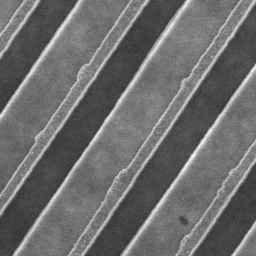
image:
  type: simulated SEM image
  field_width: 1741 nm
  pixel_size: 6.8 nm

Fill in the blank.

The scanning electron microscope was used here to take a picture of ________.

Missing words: lines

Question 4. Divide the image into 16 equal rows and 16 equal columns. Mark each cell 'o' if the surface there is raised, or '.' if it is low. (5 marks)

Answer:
oo...oooo..ooooo
o...oooo...oooo.
o..oooo...oooo..
...oooo..ooooo..
..oooo...oooo...
.oooo...oooo...o
ooooo..ooooo..oo
oooo...oooo...oo
ooo...oooo...ooo
ooo..ooooo..oooo
oo...oooo..ooooo
o...oooo...oooo.
o..ooooo..oooo..
..ooooo..ooooo..
..oooo...oooo...
.oooo...oooo...o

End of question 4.